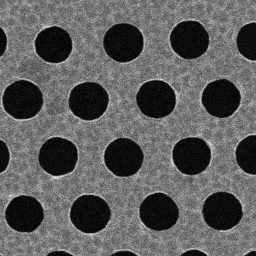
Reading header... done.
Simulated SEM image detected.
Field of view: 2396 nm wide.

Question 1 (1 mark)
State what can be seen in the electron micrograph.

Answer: a regular array of holes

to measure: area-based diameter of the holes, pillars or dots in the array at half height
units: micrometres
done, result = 0.37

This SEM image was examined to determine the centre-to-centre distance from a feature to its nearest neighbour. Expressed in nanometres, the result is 599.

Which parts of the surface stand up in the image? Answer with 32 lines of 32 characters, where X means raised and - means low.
XXXXXXXXXXXXXXXXXXXXXXXXXXXXXXXX
XXXXXXXXXXXXXXXXXXXXXXXXXXXXXXXX
XXXXXXXXXXXXXXXXXXXXXXXXXXXXXXXX
XXXXXX--XXXXXX---XXXXX----XXXX--
-XXXX----XXXX-----XXX-----XXXX--
-XXX-----XXXX-----XXX-----XXXX--
-XXX-----XXXX-----XXXX----XXXX--
XXXXX---XXXXXX---XXXXXXXXXXXXXX-
XXXXXXXXXXXXXXXXXXXXXXXXXXXXXXXX
XXXXXXXXXXXXXXXXXXXXXXXXXXXXXXXX
X---XXXXXX--XXXXXX---XXXXX---XXX
X----XXXX----XXXX-----XXX-----XX
-----XXXX-----XXX-----XXX-----XX
-----XXXX----XXXX-----XXXX----XX
X---XXXXXX---XXXXX---XXXXXX--XXX
XXXXXXXXXXXXXXXXXXXXXXXXXXXXXXXX
XXXXXXXXXXXXXXXXXXXXXXXXXXXXXXXX
XXXXXX---XXXXX--XXXXXXX--XXXXX--
-XXXX-----XXX-----XXXX----XXXX--
-XXXX-----XXX-----XXX-----XXX---
-XXXX-----XXX-----XXXX----XXXX--
XXXXXX---XXXXX---XXXXXX--XXXXXX-
XXXXXXXXXXXXXXXXXXXXXXXXXXXXXXXX
XXXXXXXXXXXXXXXXXXXXXXXXXXXXXXXX
XX--XXXXXX--XXXXXX---XXXXX---XXX
X----XXXX----XXXXX----XXX-----XX
X----XXXX-----XXX-----XXX-----XX
X----XXXX-----XXXX----XXXX----XX
X----XXXXX---XXXXXX--XXXXXX--XXX
XXXXXXXXXXXXXXXXXXXXXXXXXXXXXXXX
XXXXXXXXXXXXXXXXXXXXXXXXXXXXXXXX
XXXXXX--XXXXXXX-XXXXXXX--XXXXXX-